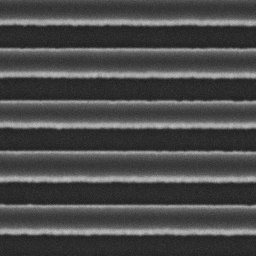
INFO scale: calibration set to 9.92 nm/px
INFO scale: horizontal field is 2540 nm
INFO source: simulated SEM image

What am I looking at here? lines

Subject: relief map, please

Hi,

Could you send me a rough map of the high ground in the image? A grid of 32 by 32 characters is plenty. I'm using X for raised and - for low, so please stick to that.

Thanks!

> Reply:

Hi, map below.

XXXXXXXXXXXXXXXXXXXXXXXXXXXXXXXX
XXXXXXXXXXXXXXXXXXXXXXXXXXXXXXXX
XXXXXXXXXXXXXXXXXXXXXXXXXXXXXXXX
--------------------------------
--------------------------------
--------------------------------
XXXXXXXXXXXXXXXXXXXXXXXXXXXXXXXX
XXXXXXXXXXXXXXXXXXXXXXXXXXXXXXXX
XXXXXXXXXXXXXXXXXXXXXXXXXXXXXXXX
--------------------------X-X--X
--------------------------------
--------------------------------
--------------------------------
XXXXXXXXXXXXXXXXXXXXXXXXXXXXXXXX
XXXXXXXXXXXXXXXXXXXXXXXXXXXXXXXX
XXXXXXXXXXXXXXXXXXXXXXXXXXXXXXXX
--------------------------------
--------------------------------
--------------------------------
XXXXXXXXXXXXXXXXXXXXXXXXXXXXXXXX
XXXXXXXXXXXXXXXXXXXXXXXXXXXXXXXX
XXXXXXXXXXXXXXXXXXXXXXXXXXXXXXXX
X--XX-XXX--XXX-XXXXXXXXXXXXXXXXX
--------------------------------
--------------------------------
--------------------------------
XXXXXXXXXXXXXXXXXXXXXXXXXXXXXXXX
XXXXXXXXXXXXXXXXXXXXXXXXXXXXXXXX
XXXXXXXXXXXXXXXXXXXXXXXXXXXXXXXX
--------------------------------
--------------------------------
--------------------------------